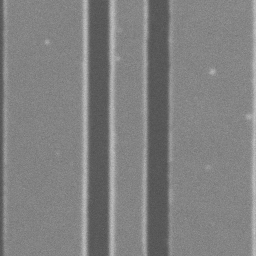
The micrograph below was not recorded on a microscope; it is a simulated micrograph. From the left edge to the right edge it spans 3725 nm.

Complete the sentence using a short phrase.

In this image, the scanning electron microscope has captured lines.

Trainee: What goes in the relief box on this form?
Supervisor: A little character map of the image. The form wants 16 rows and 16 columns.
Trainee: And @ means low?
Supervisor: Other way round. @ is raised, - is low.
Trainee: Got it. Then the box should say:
@@@@@--@@--@@@@@
@@@@@--@@--@@@@@
@@@@@--@@--@@@@@
@@@@@--@@--@@@@@
@@@@@--@@--@@@@@
@@@@@--@@--@@@@@
@@@@@--@@--@@@@@
@@@@@--@@--@@@@@
@@@@@--@@--@@@@@
@@@@@--@@--@@@@@
@@@@@--@@--@@@@@
@@@@@--@@--@@@@@
@@@@@--@@--@@@@@
@@@@@--@@--@@@@@
@@@@@--@@--@@@@@
@@@@@--@@--@@@@@